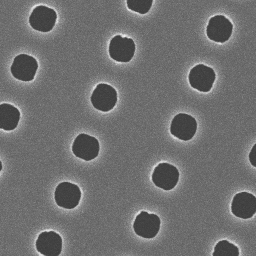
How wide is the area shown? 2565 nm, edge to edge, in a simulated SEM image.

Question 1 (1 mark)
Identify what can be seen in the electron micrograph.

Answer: a regular array of holes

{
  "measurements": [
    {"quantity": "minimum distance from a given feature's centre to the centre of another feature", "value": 521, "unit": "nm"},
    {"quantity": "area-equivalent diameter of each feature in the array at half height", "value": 270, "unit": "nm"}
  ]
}